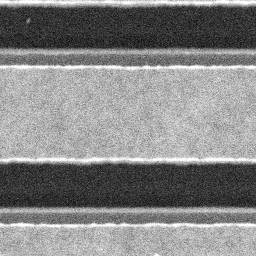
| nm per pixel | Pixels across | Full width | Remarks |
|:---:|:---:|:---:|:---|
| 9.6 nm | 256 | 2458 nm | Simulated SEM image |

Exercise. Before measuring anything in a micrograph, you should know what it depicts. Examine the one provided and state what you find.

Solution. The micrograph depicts lines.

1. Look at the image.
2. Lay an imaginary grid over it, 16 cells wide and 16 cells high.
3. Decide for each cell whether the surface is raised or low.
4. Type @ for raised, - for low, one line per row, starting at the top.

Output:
----------------
----------------
----------------
@@@@@@@@@@@@@@@@
@@@@@@@@@@@@@@@@
@@@@@@@@@@@@@@@@
@@@@@@@@@@@@@@@@
@@@@@@@@@@@@@@@@
@@@@@@@@@@@@@@@@
@@@@@@@@@@@@@@@@
----------------
----------------
----------------
@@@@@@@@@@@@@@@@
@@@@@@@@@@@@@@@@
@@@@@@@@@@@@@@@@